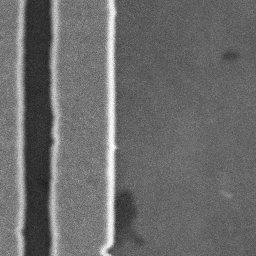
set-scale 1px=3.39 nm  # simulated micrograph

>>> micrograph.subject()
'one or a few lines or trenches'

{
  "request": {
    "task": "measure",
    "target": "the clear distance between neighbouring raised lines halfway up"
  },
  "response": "103 nanometres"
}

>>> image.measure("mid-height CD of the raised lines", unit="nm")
200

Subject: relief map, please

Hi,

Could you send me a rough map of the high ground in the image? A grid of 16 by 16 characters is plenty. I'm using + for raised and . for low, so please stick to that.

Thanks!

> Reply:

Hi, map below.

+..++++.........
+..++++.........
+..++++.........
+..++++.........
+..++++.........
+..++++.........
+..++++.........
+..++++.........
+..++++.........
+..++++.........
+..++++.........
+..++++.........
+..++++.........
+..++++.........
+..++++.........
+..++++.........